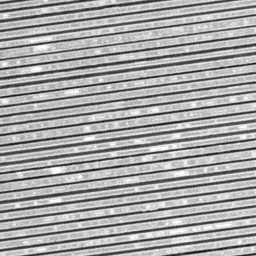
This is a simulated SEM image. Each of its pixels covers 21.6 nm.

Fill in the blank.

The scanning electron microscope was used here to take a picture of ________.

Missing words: parallel lines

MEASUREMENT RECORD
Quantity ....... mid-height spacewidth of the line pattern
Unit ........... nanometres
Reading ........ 61.6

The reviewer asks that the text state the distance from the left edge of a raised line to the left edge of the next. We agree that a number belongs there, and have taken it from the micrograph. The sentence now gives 204 nanometers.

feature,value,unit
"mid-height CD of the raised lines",6.44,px